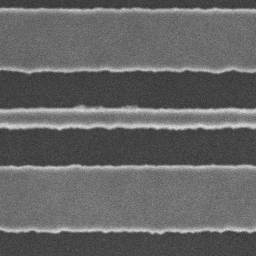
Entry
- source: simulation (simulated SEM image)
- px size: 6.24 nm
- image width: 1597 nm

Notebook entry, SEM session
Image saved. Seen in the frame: lines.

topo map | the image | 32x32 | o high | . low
................................
oooooooooooooooooooooooooooooooo
oooooooooooooooooooooooooooooooo
oooooooooooooooooooooooooooooooo
oooooooooooooooooooooooooooooooo
oooooooooooooooooooooooooooooooo
oooooooooooooooooooooooooooooooo
oooooooooooooooooooooooooooooooo
oooooooooooooooooooooooooooooooo
................................
................................
................................
................................
................................
oooooooooooooooooooooooooooooooo
oooooooooooooooooooooooooooooooo
................................
................................
................................
................................
................................
oooooooooooooooooooooooooooooooo
oooooooooooooooooooooooooooooooo
oooooooooooooooooooooooooooooooo
oooooooooooooooooooooooooooooooo
oooooooooooooooooooooooooooooooo
oooooooooooooooooooooooooooooooo
oooooooooooooooooooooooooooooooo
oooooooooooooooooooooooooooooooo
................................
................................
................................